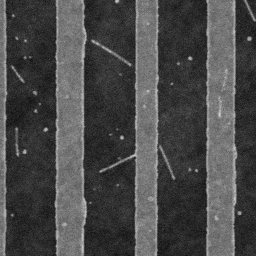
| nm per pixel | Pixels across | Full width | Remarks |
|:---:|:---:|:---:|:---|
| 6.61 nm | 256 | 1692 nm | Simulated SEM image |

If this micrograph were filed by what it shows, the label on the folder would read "lines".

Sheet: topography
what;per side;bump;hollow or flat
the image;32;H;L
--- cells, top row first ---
HLLLLLLHHHLLLLLLLHHHLLLLLLHHHLLL
HLLLLLLHHHHLLLLLLHHHLLLLLLHHHLLL
HLLLLLLHHHLLLLLLLHHHLLLLLLHHHLLL
HLLLLLLHHHHLLLLLLHHHLLLLLLHHHLLL
HLLLLLLHHHHLLLLLLHHHLLLLLLHHHLLL
HLLLLLLHHHHLLLLLLHHHLLLLLLHHHLLL
HLLLLLLHHHLLLLLLLHHHLLLLLLHHHLLL
HLLLLLLHHHLLLLLLLHHHLLLLLLHHHLLL
HLLLLLLHHHLLLLLLLHHHLLLLLLHHHLLL
HLLLLLLHHHLLLLLLLHHHLLLLLLHHHLLL
HLLLLLLHHHLLLLLLLHHHLLLLLLHHHLLL
HLLLLLLHHHLLLLLLLHHHLLLLLLHHHLLL
HLLLLLLHHHLLLLLLLHHHLLLLLLHHHLLL
HLLLLLLHHHLLLLLLLHHHLLLLLLHHHLLL
HLLLLLLHHHLLLLLLLHHHLLLLLLHHHLLL
HLLLLLLHHHLLLLLLLHHHLLLLLLHHHLLL
HLLLLLLHHHLLLLLLLHHHLLLLLLHHHLLL
HLLLLLLHHHLLLLLLLHHHLLLLLLHHHLLL
HLLLLLLHHHLLLLLLLHHHLLLLLLHHHLLL
HLLLLLLHHHLLLLLLLHHHLLLLLLHHHLLL
HLLLLLLHHHLLLLLLLHHHLLLLLLHHHLLL
HLLLLLLHHHLLLLLLLHHHLLLLLLHHHLLL
HLLLLLLHHHLLLLLLLHHHLLLLLLHHHLLL
HLLLLLLHHHLLLLLLLHHHLLLLLLHHHLLL
HLLLLLLHHHLLLLLLLHHHLLLLLLHHHLLL
HLLLLLLHHHHLLLLLLHHHLLLLLLHHHLLL
HLLLLLLHHHHLLLLLLHHHLLLLLLHHHLLL
HLLLLLLHHHHLLLLLLHHHLLLLLLHHHLLL
HLLLLLLHHHLLLLLLLHHHLLLLLLHHHLLL
HLLLLLLHHHLLLLLLLHHHLLLLLLHHHLLL
HLLLLLLHHHLLLLLLLHHHLLLLLLHHHLLL
HLLLLLLHHHLLLLLLLHHHLLLLLLHHHLLL